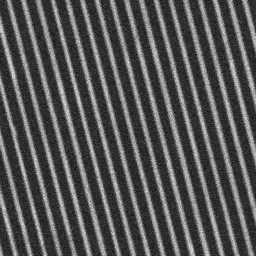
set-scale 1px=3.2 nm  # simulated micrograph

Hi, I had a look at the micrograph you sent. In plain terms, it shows parallel lines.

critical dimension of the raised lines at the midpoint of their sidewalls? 11.3 nanometres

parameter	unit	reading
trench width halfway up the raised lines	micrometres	0.0333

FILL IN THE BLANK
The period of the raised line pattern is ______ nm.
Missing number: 45.6